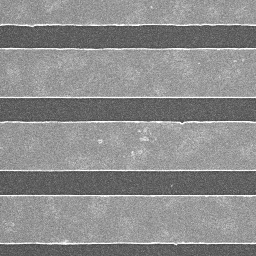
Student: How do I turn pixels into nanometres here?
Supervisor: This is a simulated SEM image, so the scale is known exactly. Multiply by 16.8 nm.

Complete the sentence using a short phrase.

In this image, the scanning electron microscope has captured one or a few lines or trenches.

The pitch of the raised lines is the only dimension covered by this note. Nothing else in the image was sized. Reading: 1.23 µm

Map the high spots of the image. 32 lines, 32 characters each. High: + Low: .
++++++++++++++++++++++++++++++++
++++++++++++++++++++++++++++++++
++++++++++++++++++++++++++++++++
................................
................................
................................
++++++++++++++++++++++++++++++++
++++++++++++++++++++++++++++++++
++++++++++++++++++++++++++++++++
++++++++++++++++++++++++++++++++
++++++++++++++++++++++++++++++++
++++++++++++++++++++++++++++++++
................................
................................
................................
++++++++++++++++++++++++++++++++
++++++++++++++++++++++++++++++++
++++++++++++++++++++++++++++++++
++++++++++++++++++++++++++++++++
++++++++++++++++++++++++++++++++
++++++++++++++++++++++++++++++++
................................
................................
................................
+++++++++++++.++++.++.+++..+++++
++++++++++++++++++++++++++++++++
++++++++++++++++++++++++++++++++
++++++++++++++++++++++++++++++++
++++++++++++++++++++++++++++++++
++++++++++++++++++++++++++++++++
................................
................................